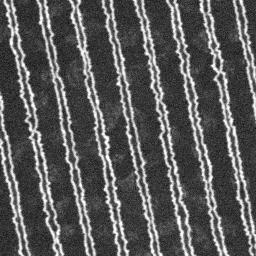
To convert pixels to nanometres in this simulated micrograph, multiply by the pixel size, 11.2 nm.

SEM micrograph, parallel lines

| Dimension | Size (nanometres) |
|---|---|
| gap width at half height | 276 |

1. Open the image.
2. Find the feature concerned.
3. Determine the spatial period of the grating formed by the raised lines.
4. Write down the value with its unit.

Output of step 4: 0.359 microns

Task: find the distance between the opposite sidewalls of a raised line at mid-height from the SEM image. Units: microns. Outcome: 0.0824